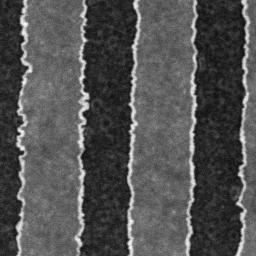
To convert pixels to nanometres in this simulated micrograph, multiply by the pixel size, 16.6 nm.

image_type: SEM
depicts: one or a few lines or trenches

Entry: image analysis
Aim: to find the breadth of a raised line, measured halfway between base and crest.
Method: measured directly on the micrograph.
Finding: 1000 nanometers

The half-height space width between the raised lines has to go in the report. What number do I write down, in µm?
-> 0.822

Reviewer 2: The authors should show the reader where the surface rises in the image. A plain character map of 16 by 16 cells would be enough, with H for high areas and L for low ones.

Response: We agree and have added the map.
LLHHHLLLLHHHLLLH
LHHHHLLLLHHHLLLH
LHHHHLLLHHHHLLLH
LHHHHLLLHHHHLLLH
LLHHHLLLHHHHLLLH
LHHHHLLLHHHHLLLH
LHHHHLLLHHHHLLLH
LHHHHLLLHHHHLLLH
LHHHHLLLHHHHLLLH
LHHHHLLLHHHHLLLH
LHHHHLLLHHHHLLLH
LHHHHLLLHHHHLLLH
LHHHHLLLHHHHLLLH
LHHHHLLLHHHHLLLH
LHHHHLLLHHHHLLLH
LHHHHLLLHHHHLLLH